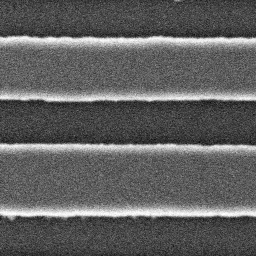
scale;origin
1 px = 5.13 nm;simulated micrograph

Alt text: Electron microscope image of lines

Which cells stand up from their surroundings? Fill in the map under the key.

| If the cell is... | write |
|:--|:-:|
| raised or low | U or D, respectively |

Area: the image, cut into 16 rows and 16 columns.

DDDDDDDDDDDDDDDD
DDDDDDDDDDDDDDDD
UUUUUUUUUUUUUUUU
UUUUUUUUUUUUUUUU
UUUUUUUUUUUUUUUU
UUUUUUUUUUUUUUUU
DDDDDDDDDDDDDDDD
DDDDDDDDDDDDDDDD
DDDDDDDDDDDDDDDD
UUUUUUUUUUUUUUUU
UUUUUUUUUUUUUUUU
UUUUUUUUUUUUUUUU
UUUUUUUUUUUUUUUU
DDDDDDDDDDDDDDDD
DDDDDDDDDDDDDDDD
DDDDDDDDDDDDDDDD